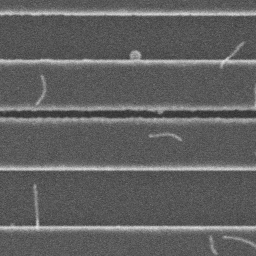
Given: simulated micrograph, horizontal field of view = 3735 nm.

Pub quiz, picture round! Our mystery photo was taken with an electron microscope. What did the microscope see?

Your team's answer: lines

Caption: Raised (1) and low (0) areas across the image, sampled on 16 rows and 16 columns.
1111111111111111
0000000000000000
0000000000000000
0000000000000000
1111111111111111
1111111111111111
1111111111111111
1111111111111111
1111111111111111
1111111111111111
1111111111111111
0000000000000000
0000000000000000
0000000000000000
1111111111111111
1111111111111111